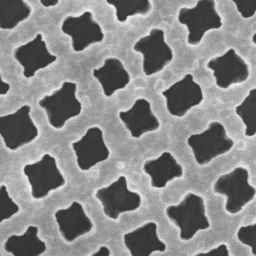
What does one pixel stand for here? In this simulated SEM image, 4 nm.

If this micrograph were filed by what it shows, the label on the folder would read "a regular array of holes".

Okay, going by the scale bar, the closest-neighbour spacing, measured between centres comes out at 210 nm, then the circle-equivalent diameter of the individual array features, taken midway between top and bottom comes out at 142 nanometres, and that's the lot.